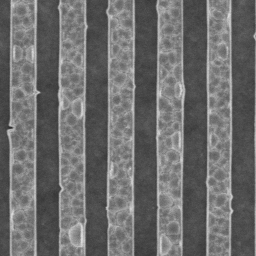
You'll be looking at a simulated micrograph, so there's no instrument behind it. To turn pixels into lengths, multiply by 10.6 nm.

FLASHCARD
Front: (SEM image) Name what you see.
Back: parallel lines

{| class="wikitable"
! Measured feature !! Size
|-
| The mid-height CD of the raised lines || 270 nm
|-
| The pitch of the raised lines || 0.52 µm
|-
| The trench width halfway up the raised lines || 253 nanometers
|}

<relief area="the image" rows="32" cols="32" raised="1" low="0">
01110001111000111000111000111000
01110001111001111000111000111000
01110000111000111000111000111000
01110000111000111000111000111000
01110000111000111000111000111000
01110000111000111000111000111000
01110000111000111000111000111000
01110001111000111000111000111000
01110001111000111000111000111000
01110001111000111000111000111000
01110001111000111000111000111000
01111001111000111000111000111000
01110001111000111000111000111000
01110001111000111000111000111000
01110001111000111000111000111000
01110001110000111000111000111000
01110001110000111000111000111000
01110001110000111000111000111000
01110001110000111000111000111000
01110001110000111000111000111000
01110000110000111000111000111000
01110000110001111000111000111000
01110000110001111000111000111000
01110000110001111000111000111000
01110000111001111000111000111000
01110000111001111000111000111000
01110000111001111000111000111000
01110000111000111000111000111000
01110000111000111000111000111000
01110000111000111000111000111000
01110000111000111000111000111000
01110000111000111000111000111000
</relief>